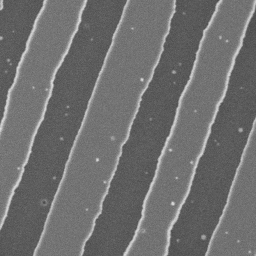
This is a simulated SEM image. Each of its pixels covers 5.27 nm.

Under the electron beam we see lines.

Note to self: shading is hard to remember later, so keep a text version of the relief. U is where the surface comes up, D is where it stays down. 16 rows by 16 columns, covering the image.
DDDUUDDDUUUDDUUU
DDUUUDDUUUUDDUUU
DDUUUDDUUUDDDUUD
DUUUDDDUUUDDUUUD
DUUUDDUUUUDDUUDD
DUUDDDUUUDDDUUDD
UUUDDDUUUDDUUUDD
UUUDDUUUDDDUUDDD
UUDDDUUUDDDUUDDD
UUDDUUUUDDUUUDDU
UUDDUUUDDDUUDDDU
UDDDUUUDDUUUDDDU
UDDUUUDDDUUUDDUU
DDDUUUDDDUUDDDUU
DDDUUUDDUUUDDUUU
DDUUUDDDUUUDDUUU